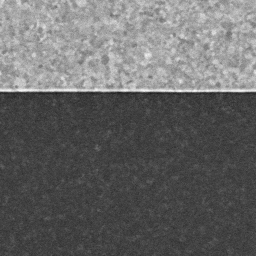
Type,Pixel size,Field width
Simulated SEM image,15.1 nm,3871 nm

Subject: one or a few lines or trenches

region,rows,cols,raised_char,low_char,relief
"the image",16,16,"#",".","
################
################
################
################
################
################
................
................
................
................
................
................
................
................
................
................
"